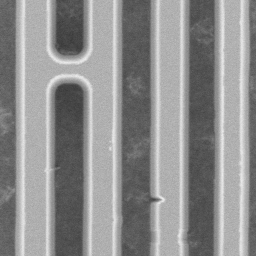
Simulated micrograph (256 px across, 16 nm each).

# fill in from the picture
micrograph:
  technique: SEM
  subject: one or a few lines or trenches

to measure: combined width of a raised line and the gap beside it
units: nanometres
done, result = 1050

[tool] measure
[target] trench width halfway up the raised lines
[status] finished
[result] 583 nanometres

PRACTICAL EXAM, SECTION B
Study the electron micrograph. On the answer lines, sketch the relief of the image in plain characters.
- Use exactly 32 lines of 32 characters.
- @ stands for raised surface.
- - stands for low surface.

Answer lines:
---@@@-----@@@@----@@@@----@@@@-
---@@@-----@@@@----@@@@----@@@@-
---@@@-----@@@@----@@@@----@@@@-
---@@@-----@@@@----@@@@----@@@@-
---@@@-----@@@@----@@@@----@@@@-
--@@@@-----@@@@----@@@@----@@@@-
--@@@@@----@@@@----@@@@----@@@@-
---@@@@@@@@@@@@----@@@@----@@@@-
---@@@@@@@@@@@@----@@@@----@@@@-
---@@@@@@@@@@@@----@@@@----@@@@-
---@@@@---@@@@@----@@@@----@@@@-
---@@@-----@@@@----@@@@----@@@@-
---@@@-----@@@@----@@@@----@@@@-
---@@@-----@@@@----@@@@----@@@@-
---@@@-----@@@@----@@@@----@@@@-
---@@@-----@@@@----@@@@----@@@@-
---@@@-----@@@@----@@@@----@@@@-
---@@@-----@@@@----@@@@----@@@@-
---@@@-----@@@@----@@@@----@@@@-
---@@@-----@@@@----@@@@----@@@@-
---@@@-----@@@@----@@@@----@@@@-
---@@@-----@@@@----@@@@----@@@@-
---@@@-----@@@@----@@@@----@@@@-
---@@@-----@@@@----@@@@----@@@@-
---@@@-----@@@@-----@@@----@@@@-
---@@@-----@@@@----@@@@----@@@@-
---@@@-----@@@@----@@@@----@@@@-
---@@@-----@@@@----@@@@----@@@@-
---@@@-----@@@@----@@@@----@@@@-
---@@@-----@@@@----@@@@----@@@@-
---@@@-----@@@@----@@@@----@@@--
---@@@-----@@@@----@@@@----@@@--